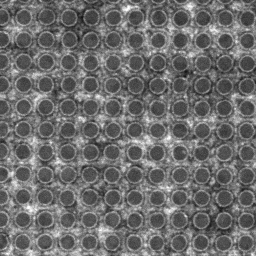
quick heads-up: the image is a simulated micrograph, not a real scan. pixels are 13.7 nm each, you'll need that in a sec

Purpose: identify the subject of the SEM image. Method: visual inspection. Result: a regular array of raised bodies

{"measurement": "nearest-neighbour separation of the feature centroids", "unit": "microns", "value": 0.302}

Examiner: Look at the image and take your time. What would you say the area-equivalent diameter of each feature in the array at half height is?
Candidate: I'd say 220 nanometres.